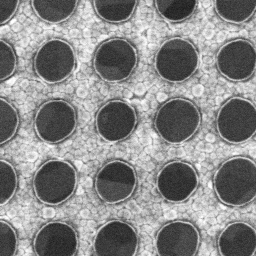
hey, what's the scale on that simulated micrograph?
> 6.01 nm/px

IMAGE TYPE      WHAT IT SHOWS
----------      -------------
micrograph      a regular array of raised bodies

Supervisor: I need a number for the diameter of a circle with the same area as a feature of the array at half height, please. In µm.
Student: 0.253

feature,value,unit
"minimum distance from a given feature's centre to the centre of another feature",364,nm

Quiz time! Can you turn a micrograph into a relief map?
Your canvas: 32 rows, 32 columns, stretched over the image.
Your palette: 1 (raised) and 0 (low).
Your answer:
11001111110011111001111110011111
11001111100011111000111100011111
10000111000001110000011000001110
00000000000000000000000000000000
00000000000000000000000000000000
10000011000001110000111100001110
11000111100011111000111110011111
11001111100011111000111110011111
11001111100011111001111110011111
10000111100001110000111100001110
00000000000000000000000000000000
00000000001000000000000010000000
00000000000000000000011000000110
11000111100001110000111110001111
11000111100011111000111110011111
11001111100011111001111110011111
11000111100011110000111100011111
10000111000001100000011000001110
00000000000000000000000000000000
00000000000000000000000000000000
10000011100001110000011000001111
11000111100011111000111100011111
11001111110011111000111110011111
11001111110011111000111100011111
11000111100001110000111100011111
00000010000000000000000000001110
00000010000000000000000000000000
00000000000000000000010000000000
10000111100001110000111100001111
11000111110011111000111110001111
11001111110011111000111110011111
11001111100011111000111100001111